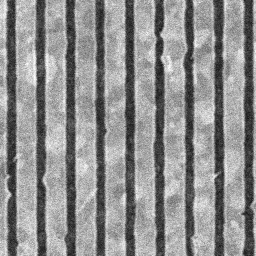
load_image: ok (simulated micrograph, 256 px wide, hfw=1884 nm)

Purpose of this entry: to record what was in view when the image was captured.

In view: parallel lines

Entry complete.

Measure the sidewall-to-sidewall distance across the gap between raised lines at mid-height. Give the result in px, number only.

11.2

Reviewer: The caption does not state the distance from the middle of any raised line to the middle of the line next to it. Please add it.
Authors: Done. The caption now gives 29.7 pixels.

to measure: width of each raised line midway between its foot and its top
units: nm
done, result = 138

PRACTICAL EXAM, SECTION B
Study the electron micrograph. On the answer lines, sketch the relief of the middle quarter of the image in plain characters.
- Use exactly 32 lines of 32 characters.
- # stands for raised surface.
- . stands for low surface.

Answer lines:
...#####...####...#####..#####..
...#####...####...####....####..
...#####...####...####....####..
...####....####...####....####..
...#####...####...####....####..
...#####...####...####...#####..
...#####...####...#####...####..
...#####...####...#####...####..
...####....####...####...#####..
...####....####...####...#####..
...#####...####...#####..#####..
...#####...####...#####..#####..
...#####...####...####...#####..
...#####...####...####...#####..
...#####...####...####...#####..
...#####...####...####...#####..
...#####...####...#####..#####..
...#####...####...#####..#####..
...#####..#####...####...#####..
...#####...####...####...#####..
...####....####...####...#####..
...#####...####...####...#####..
...#####...####...####...#####..
...#####...####...####...#####..
...#####...####...####...#####..
...#####...####...####...#####..
...#####...####...####...#####..
...#####...####...####...#####..
...#####...####...####...#####..
...#####...####...####...#####..
...#####...####...####...#####..
...#####...####...####...#####..